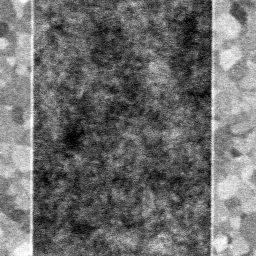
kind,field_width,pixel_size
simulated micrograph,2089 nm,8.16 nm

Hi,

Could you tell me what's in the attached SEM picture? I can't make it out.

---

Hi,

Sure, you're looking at one or a few lines or trenches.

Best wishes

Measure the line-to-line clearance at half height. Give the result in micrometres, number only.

1.47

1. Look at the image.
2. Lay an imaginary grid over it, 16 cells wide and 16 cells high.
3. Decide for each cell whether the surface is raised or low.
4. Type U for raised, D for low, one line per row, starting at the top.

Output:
UUDDDDDDDDDDDUUU
UUDDDDDDDDDDDUUU
UUDDDDDDDDDDDUUU
UUDDDDDDDDDDDUUU
UUDDDDDDDDDDDUUU
UUDDDDDDDDDDDUUU
UUDDDDDDDDDDDUUU
UUDDDDDDDDDDDUUU
UUDDDDDDDDDDDUUU
UUDDDDDDDDDDDUUU
UUDDDDDDDDDDDUUU
UUDDDDDDDDDDDUUU
UUDDDDDDDDDDDUUU
UUDDDDDDDDDDDUUU
UUDDDDDDDDDDDUUU
UUDDDDDDDDDDDUUU